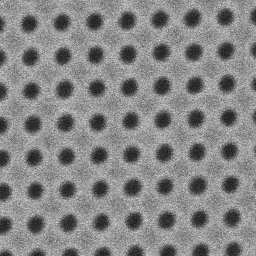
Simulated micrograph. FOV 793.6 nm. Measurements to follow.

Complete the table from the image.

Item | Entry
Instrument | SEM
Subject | a regular array of holes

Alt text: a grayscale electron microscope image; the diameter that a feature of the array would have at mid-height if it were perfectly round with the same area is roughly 57.5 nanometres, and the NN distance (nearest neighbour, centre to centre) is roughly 101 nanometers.